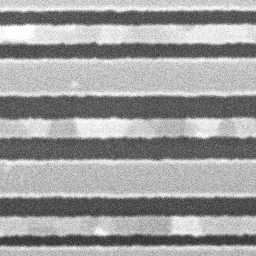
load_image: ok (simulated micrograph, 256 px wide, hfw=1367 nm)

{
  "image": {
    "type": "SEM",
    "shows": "lines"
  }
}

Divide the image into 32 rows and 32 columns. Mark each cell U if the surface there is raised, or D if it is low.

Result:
UUUUUUUUUUUUUUUUUUUUUUUUUUUUUUUU
DDDDDDDDDDDDDDDDDDDDDDDDDDDDDDDD
DDDDDDDDDDDDDDDDDDDDDDDDDDDDDDDD
UUUUUUUUUUUUUUUUUUUUUUUUUUUUUUUU
UUUUUUUUUUUUUUUUUUUUUUUUUUUUUUUU
DDDDDDDDDDDDDDDDDDDDDDDDDDDDDDDD
DDDDDDDDDDDDDDDDDDDDDDDDDDDDDDDD
UUDDDUDDDUUUDDDUUUUUUUUUUUUUUUUU
UUUUUUUUUUUUUUUUUUUUUUUUUUUUUUUU
UUUUUUUUUUUUUUUUUUUUUUUUUUUUUUUU
UUUUUUUUUUUUUUUUUUUUUUUUUUUUUUUU
UUUUUUUUUUUUUUUUUUUUUUUUUUUUUUUU
DDDDDDDDDDDDDDDDDDDDDDDDDDDDDDDD
DDDDDDDDDDDDDDDDDDDDDDDDDDDDDDDD
DDDDDDDDDDDDDDDDDDDDDDDDDDDDDDDD
UUUUUUUUUUUUUUUUUUUUUUUUUUUUUUUU
UUUUUUUUUUUUUUUUUUUUUUUUUUUUUUUU
DDDDDDDDDDDDDDDDDDDDDDDDDDDDDDDD
DDDDDDDDDDDDDDDDDDDDDDDDDDDDDDDD
DDDDDDDDDDDDDDDDDDDDDDDDDDDDDDDD
UUUUUUUUUUUUUUUUUUUUUUUUUUUUUUUU
UUUUUUUUUUUUUUUUUUUUUUUUUUUUUUUU
UUUUUUUUUUUUUUUUUUUUUUUUUUUUUUUU
UUUUUUUUUUUUUUUUUUUUUUUUUUUUUUUU
UUUUUUUUUUUUUUUUUUUUUUUUUUUUUUUU
DDDDDDDDDDDDDDDDDDDDDDDDDDDDDDDD
DDDDDDDDDDDDDDDDDDDDDDDDDDDDDDDD
UUUUUUUUUUUUUUUUUUUUUUUUUUUUUUUU
UUUUUUUUUUUUUUUUUUUUUUUUUUUUUUUU
DDDDDDDDDDDDDDDDDDDDDDDDDDDDDDDD
DDDDDDDDDDDDDDDDDDDDDDDDDDDDDDDD
UUUUUUUUUUUUUUUUUUUUUUUUUUUUUUUU